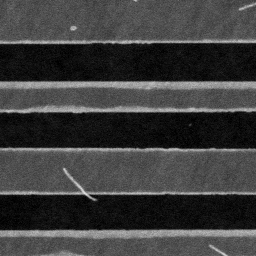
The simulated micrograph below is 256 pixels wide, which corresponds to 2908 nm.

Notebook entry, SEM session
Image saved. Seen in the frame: lines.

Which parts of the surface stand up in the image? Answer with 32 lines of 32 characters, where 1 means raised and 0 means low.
11111111111111111111111111111111
11111111111111111111111111111111
11111111111111111111111111111111
11111111111111111111111111111111
11111111111111111111111111111111
00000000000000000000000000000000
00000000000000000000000000000000
00000000000000000000000000000000
00000000000000000000000000000000
00000000000000000000000000000000
00000001111111100000000000000000
11111111111111111111111111111111
11111111111111111111111111111111
11111111111111111111111111111111
00000000000000000000000000000000
00000000000000000000000000000000
00000000000000000000000000000000
00000000000000000000000000000000
00000000000000000000000000000000
11111111111111111111111111111111
11111111111111111111111111111111
11111111111111111111111111111111
11111111111111111111111111111111
11111111111111111111111111111111
00000000000000000000000000000000
00000000000000000000000000000000
00000000000000000000000000000000
00000000000000000000000000000000
00000000000000000000000000000000
11111111111111111111111111111111
11111111111111111111111111111111
11111111111111111111111111111111